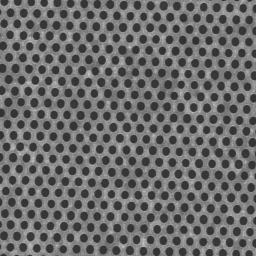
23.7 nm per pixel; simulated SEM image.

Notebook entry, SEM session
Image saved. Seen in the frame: a regular array of holes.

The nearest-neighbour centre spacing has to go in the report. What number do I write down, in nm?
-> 300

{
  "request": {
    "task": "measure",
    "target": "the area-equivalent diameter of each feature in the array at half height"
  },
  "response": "207 nanometers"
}